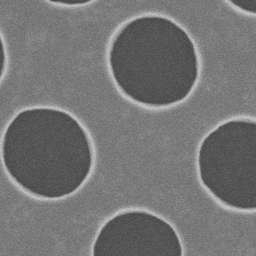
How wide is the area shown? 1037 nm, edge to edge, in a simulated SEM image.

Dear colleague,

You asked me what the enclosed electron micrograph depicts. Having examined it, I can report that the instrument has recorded holes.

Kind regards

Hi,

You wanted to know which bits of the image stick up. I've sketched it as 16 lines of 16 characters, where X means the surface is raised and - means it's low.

XXXXXXXXXXXXXXX-
XXXXXXXX---XXXXX
XXXXXXX-----XXXX
XXXXXXX-----XXXX
XXXXXXX-----XXXX
XXXXXXXX----XXXX
XXXXXXXXX--XXXXX
X----XXXXXXXXXXX
-----XXXXXXXX---
------XXXXXXX---
------XXXXXX----
X----XXXXXXXX---
XXXXXXXXXXXXXX--
XXXXXXX---XXXXXX
XXXXXX-----XXXXX
XXXXXX-----XXXXX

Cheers